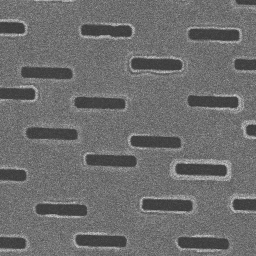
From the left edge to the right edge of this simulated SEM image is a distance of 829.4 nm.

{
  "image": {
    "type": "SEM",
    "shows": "a regular array of holes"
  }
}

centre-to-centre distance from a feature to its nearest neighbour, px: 54.7